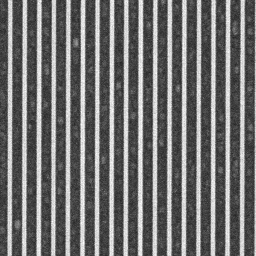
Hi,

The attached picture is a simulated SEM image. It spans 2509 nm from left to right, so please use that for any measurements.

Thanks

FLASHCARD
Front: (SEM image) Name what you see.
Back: parallel lines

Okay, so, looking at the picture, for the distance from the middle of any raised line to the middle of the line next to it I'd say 14.5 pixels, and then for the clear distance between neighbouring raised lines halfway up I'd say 11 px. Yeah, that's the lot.